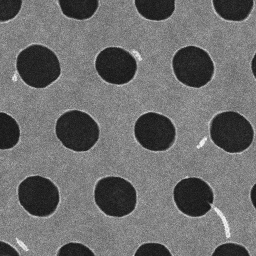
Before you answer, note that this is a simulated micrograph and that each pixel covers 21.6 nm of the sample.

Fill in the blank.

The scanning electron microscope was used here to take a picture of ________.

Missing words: a regular array of holes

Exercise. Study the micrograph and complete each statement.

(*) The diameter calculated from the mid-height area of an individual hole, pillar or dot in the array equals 0.898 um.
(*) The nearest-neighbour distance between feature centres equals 1640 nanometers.